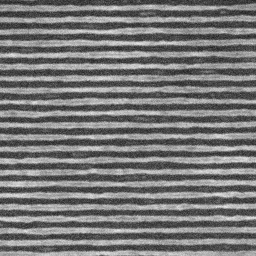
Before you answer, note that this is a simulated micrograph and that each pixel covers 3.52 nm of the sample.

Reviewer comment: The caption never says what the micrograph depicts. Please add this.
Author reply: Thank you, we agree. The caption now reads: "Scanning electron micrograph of parallel lines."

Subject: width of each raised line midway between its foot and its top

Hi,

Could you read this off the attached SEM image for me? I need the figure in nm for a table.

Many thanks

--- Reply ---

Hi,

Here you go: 12.8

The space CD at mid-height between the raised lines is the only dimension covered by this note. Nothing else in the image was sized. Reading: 28.2 nanometers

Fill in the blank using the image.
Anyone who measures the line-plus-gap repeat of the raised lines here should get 11.7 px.